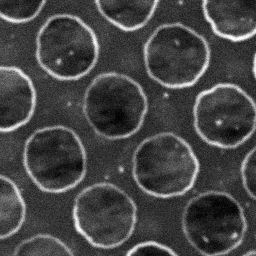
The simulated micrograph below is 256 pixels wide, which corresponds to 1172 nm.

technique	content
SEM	raised bodies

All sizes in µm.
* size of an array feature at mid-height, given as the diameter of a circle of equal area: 0.288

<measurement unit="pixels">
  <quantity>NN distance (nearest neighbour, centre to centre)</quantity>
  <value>75.8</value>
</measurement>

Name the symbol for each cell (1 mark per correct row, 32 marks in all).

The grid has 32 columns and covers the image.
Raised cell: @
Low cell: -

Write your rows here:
@@@@@-------@@@@@@@@-----@@@@@@@
@@@@@--------@@@@@@-------@@@@@@
-@@@--@@@@----@@@@--------@@@@@@
-----@@@@@@----@@---@@@----@@@@@
-----@@@@@@@-------@@@@@@---@@@-
-----@@@@@@@------@@@@@@@@------
-----@@@@@@@------@@@@@@@@------
-----@@@@@@@------@@@@@@@@------
@-----@@@@@-------@@@@@@@@------
@@@----@@@---@@----@@@@@@-------
@@@@--------@@@@@---@@@@--------
@@@@-------@@@@@@@--------@@@@--
@@@@-------@@@@@@@-------@@@@@@-
@@@@-------@@@@@@@------@@@@@@@@
@@@@-------@@@@@@@------@@@@@@@@
@@@--------@@@@@@@------@@@@@@@@
-----@@@@---@@@@@--------@@@@@@@
----@@@@@@--------@@@@@---@@@@@-
---@@@@@@@-------@@@@@@@--------
---@@@@@@@@------@@@@@@@-------@
---@@@@@@@@------@@@@@@@@-----@@
----@@@@@@@------@@@@@@@@-----@@
@---@@@@@@-------@@@@@@@------@@
@@---@@@@--@@@----@@@@@@-------@
@@--------@@@@@@----@----@@@@---
@@@------@@@@@@@@-------@@@@@@--
@@@------@@@@@@@@------@@@@@@@--
@@@------@@@@@@@@------@@@@@@@@-
@@--------@@@@@@@------@@@@@@@@-
@----------@@@@@-------@@@@@@@--
---@@@@@----@@@---@@----@@@@@@--
--@@@@@@@-------@@@@@@---@@@----